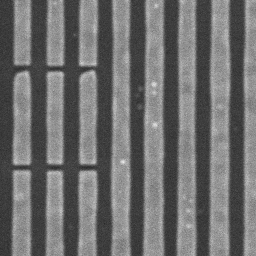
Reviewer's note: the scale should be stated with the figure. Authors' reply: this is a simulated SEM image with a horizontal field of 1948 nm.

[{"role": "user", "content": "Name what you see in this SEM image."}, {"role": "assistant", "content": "wiring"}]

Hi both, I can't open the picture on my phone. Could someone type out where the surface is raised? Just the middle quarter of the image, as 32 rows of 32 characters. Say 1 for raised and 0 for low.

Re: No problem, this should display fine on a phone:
00000000000011110000011110000111
00000000000011110000011110000111
00000111000011110000011110000111
00001111000011110000011110000111
00001111000011110000011110000111
00001111000011110000011110000111
00001111000011110000011110000111
00001111000011110000011110000111
00001111000011110000011110000111
00001111000011110000011110000111
00001111000011110000011110000111
00001111000011110000011110000111
00001111000011110000011110000111
00001111000011110000111110000111
00001111000011110000111110000111
00001111000011110000111110000111
00001111000011110000111110000111
00001111000011110000111110000111
00001111000011110000111110000111
00001111000011110000111110000111
00001111000011110000111110000111
00001111000011110000111110000111
00001111000011110000111110000111
00001111000011110000111110000111
00001111000011110000111110000111
00000000000011110000111110000111
00000000000011110000111110000111
00001111000011110000111110000111
00001111000011110000111110000111
00001111000011110000111110000111
00001111000011110000111110000111
00001111000011110000111110000111